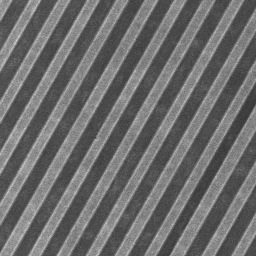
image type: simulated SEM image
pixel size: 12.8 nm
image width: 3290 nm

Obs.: parallel lines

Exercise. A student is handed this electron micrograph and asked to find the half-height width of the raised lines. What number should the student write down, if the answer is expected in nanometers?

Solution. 141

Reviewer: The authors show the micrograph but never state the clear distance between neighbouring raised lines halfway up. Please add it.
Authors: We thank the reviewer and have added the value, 176 nanometers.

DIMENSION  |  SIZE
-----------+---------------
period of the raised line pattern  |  0.323 µm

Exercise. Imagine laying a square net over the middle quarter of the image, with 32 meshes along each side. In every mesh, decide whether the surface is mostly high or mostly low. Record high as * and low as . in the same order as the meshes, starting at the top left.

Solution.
....***....***....***....***....
...***....****....***....***....
..****....***....***....***....*
..***....****....***...****....*
.****...****....***....***....**
.***....***....***....****....**
***....****....***....***....***
***....***....***....***....****
**....****....***....***....***.
**....***....***....***....***..
*....****...****...****....***..
*....***....***....***....***...
....***....***....****....***...
...****....***....***....***....
...***....***....***....****....
..****....***....***....***....*
..***....***....***....***.....*
.****....***...****....***....**
****....***....***....***.....**
***....***....****....***....***
***....***....***....***....***.
**....***....***.....***....***.
**....***....***....***....***..
*....***....***....***.....***..
*....***...****....***....***...
....***....***....***.....***...
...***....****....***....***....
...***....***....***....***.....
..***....***.....***....***....*
..***....***....***....***.....*
.***....***....***.....***....**
.***....***....***....***.....**